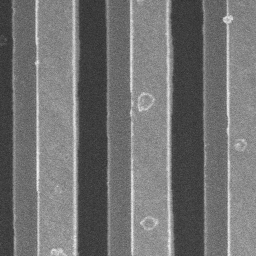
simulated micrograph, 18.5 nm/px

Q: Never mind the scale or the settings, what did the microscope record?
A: lines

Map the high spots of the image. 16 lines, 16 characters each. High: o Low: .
.oooo..oooo..ooo
.oooo..oooo..ooo
.oooo..oooo..ooo
.oooo..oooo..ooo
.oooo..oooo..ooo
.oooo..oooo..ooo
.oooo..oooo..ooo
.oooo..oooo..ooo
.oooo..oooo..ooo
.oooo..oooo..ooo
.oooo..oooo..ooo
.oooo..oooo..ooo
.oooo..oooo..ooo
.oooo..oooo..ooo
.oooo..oooo..ooo
.oooo..oooo..ooo